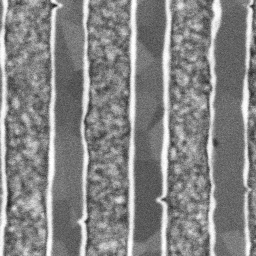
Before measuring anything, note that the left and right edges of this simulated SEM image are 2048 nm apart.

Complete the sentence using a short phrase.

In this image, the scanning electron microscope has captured one or a few lines or trenches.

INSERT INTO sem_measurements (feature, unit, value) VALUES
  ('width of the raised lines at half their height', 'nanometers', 277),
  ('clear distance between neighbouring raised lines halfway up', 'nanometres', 370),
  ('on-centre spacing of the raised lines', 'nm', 644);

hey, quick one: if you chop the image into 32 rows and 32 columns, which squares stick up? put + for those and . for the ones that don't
+......++++......++++......++++.
+......++++......++++......++++.
+......++++......++++......++++.
.......++++......++++......++++.
......+++++......++++......++++.
......+++++......++++.....+++++.
......+++++......++++.....+++++.
.......++++......++++.....+++++.
.......++++......++++.....+++++.
+......++++......++++......++++.
.......++++.....+++++......++++.
.......++++.....+++++......++++.
......+++++......++++.....+++++.
+.....+++++......++++.....+++++.
+.....+++++......++++......++++.
......++++.......++++.....+++++.
.......+++.......++++.....+++++.
......++++......+++++.....+++++.
......+++++.....+++++.....+++++.
......+++++.....+++++.....+++++.
......+++++.....+++++.....+++++.
+.....+++++.....+++++.....+++++.
+.....+++++.....+++++.....+++++.
+.....++++......+++++......++++.
+.....+++++.....++++......+++++.
+.....+++++.....++++......+++++.
+.....+++++.....+++++.....+++++.
......+++++.....+++++.....+++++.
......+++++.....+++++.....+++++.
......+++++.....+++++.....+++++.
......++++......++++......+++++.
......++++......++++......+++++.